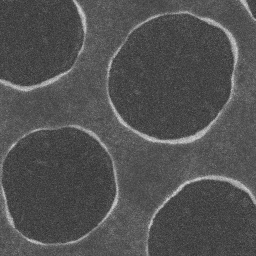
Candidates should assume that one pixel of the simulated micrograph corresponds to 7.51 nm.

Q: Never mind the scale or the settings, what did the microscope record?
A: holes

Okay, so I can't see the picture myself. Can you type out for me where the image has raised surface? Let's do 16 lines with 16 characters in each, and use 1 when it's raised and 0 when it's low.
0000011111111111
0000011110000111
0000011100000011
0000011000000001
0000111000000001
1011111000000011
1111111000000011
1111111100000111
1100001110001111
1000000111111111
0000000111111111
0000000111110001
0000000111100000
1000000111000000
1000001110000000
1111111110000000